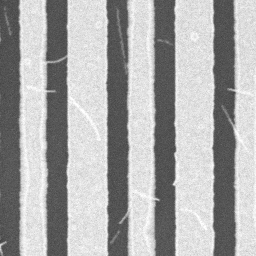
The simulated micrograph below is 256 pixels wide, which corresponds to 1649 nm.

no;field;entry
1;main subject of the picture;lines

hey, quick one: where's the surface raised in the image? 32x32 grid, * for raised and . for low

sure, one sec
...***...****...***...*****..***
...***...****...***...*****...**
...***...****...***...*****...**
...***..*****...***...*****..***
...***...****...***...*****...**
...***...****...***...*****...**
...**....****...***...*****...**
...**....****...***...*****...**
...**....****...***...*****...**
...**...*****...***...*****...**
...***..*****...***...*****...**
...***...****...***...*****...**
...***...****...***...*****...**
...***...****...***...*****...**
...***...****...***...*****...**
...**....****...***...*****..***
...**....****...***...*****..***
...**....****...***...*****...**
...**....****...***...*****...**
...**....****...***...*****...**
...**....****...***...*****...**
...***..*****...***...*****...**
...***...****...***...*****...**
...***...****...***...*****...**
...**....****...***...*****...**
...**....****...***...*****...**
...**....****...***...*****...**
...***...****...***...*****...**
...***...****...***...*****...**
...***...****...***...*****...**
...***...****...***...*****...**
...***...****...***...*****...**